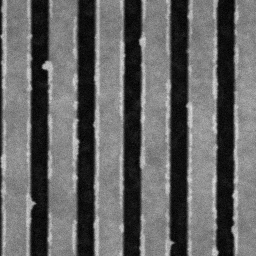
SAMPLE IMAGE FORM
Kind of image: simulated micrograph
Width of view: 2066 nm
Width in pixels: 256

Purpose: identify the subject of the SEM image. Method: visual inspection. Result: parallel lines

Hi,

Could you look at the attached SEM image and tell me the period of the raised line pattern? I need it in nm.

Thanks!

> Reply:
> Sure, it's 376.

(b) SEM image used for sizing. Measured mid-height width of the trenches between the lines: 18 px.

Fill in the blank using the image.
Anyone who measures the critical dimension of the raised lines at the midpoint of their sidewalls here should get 234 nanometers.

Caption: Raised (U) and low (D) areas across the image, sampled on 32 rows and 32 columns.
UUUUDDUUUUDDUUUDDDUUUDDDUUUDDUUU
UUUUDDUUUUDDUUUDDDUUUDDUUUUDDUUU
UUUUDDUUUUDDUUUDDDUUUDDUUUUDDUUU
UUUUDDUUUUDDUUUDDDUUUDDDUUUDDUUU
UUUUDDUUUUDDUUUDDDUUUDDDUUUDDUUU
UUUUDDUUUUDDUUUDDUUUUDDDUUUDDUUU
UUUUDDUUUUDDUUUUDDUUUDDUUUUDDUUU
UUUUDDUUUUDDUUUUDDUUUDDDUUUDDUUU
UUUUDUUUUUDDUUUUDDUUUDDDUUUDDUUU
UUUUDDUUUUDDUUUDDDUUUDDDUUUDDUUU
UUUUDDUUUUDDUUUDDDUUUDDDUUUDDUUU
UUUUDDUUUUDDUUUDDDUUUDDDUUUDDUUU
UUUUDDUUUUDDUUUDDDUUUDDUUUUDDUUU
UUUUDDUUUUDDUUUDDDUUUDDUUUUDDUUU
UUUUDDUUUUDDUUUDDDUUUDDDUUUDDUUU
UUUUDDUUUUDDUUUDDDUUUDDUUUUDDUUU
UUUUDDUUUUDDUUUDDDUUUDDDUUUDDUUU
UUUUDDUUUUDDUUUDDDUUUDDDUUUDDUUU
UUUUDDUUUUDDUUUDDDUUUDDDUUUDDUUU
UUUUDDUUUUDDUUUDDDUUUDDDUUUDDUUU
UUUUDDUUUUDDUUUDDDUUUDDDUUUDDUUU
UUUUDDUUUUDDUUUDDDUUUDDDUUUDDUUU
UUUUDDUUUUDDUUUDDDUUUDDUUUUDDUUU
UUUUDDUUUUDDUUUDDDUUUDDDUUUDDUUU
UUUUDDUUUUDDUUUDDDUUUDDDUUUDDUUU
UUUUDDUUUUDDUUUDDDUUUDDDUUUDDUUU
UUUUDDUUUUDDUUUDDDUUUDDDUUUDDUUU
UUUUDDUUUUDDUUUDDDUUUDDDUUUDDUUU
UUUUDDUUUUDDUUUDDDUUUDDDUUUDDUUU
UUUUDDUUUUDDUUUDDDUUUDDDUUUDDUUU
UUUUDDUUUUDDUUUDDDUUUUDDUUUDDUUU
UUUUDDUUUUDDUUUDDDUUUDDDUUUDDUUU